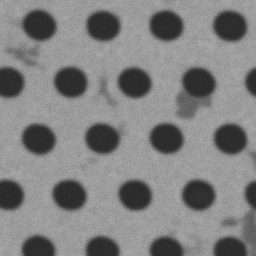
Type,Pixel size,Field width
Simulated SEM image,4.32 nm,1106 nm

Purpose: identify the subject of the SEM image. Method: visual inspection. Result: a regular array of holes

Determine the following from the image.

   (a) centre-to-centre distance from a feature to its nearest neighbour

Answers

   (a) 274 nm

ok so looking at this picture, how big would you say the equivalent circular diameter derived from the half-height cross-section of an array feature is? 135 nanometers